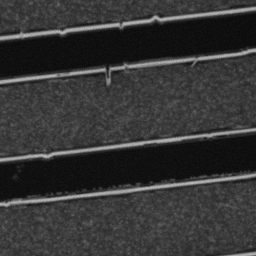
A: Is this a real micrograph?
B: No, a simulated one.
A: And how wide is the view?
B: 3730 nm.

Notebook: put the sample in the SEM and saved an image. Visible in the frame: one or a few lines or trenches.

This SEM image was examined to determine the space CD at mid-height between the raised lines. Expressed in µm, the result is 1.13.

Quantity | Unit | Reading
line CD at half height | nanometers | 643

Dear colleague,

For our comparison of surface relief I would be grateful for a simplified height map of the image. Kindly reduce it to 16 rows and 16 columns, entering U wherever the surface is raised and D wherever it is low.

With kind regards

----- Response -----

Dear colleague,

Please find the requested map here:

DDDDDDDDDDDDDDDD
DDDDDDDDUUUUUUUU
UUUUUUUUUUUUUUUU
UUUUUUUUUUUUUUDD
UUUUUDUDDDDDDDDD
DDDDDDDDDDDDDDDD
DDDDDDDDDDDDDDDD
DDDDDDDDDDDDDDDD
DDDDDDDDDDDDUUUU
DDDDUUUUUUUUUUUU
UUUUUUUUUUUUUUUU
UUUUUUUUUUUUDDDD
UUUDDDDDDDDDDDDD
DDDDDDDDDDDDDDDD
DDDDDDDDDDDDDDDD
DDDDDDDDDDDDDDDD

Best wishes